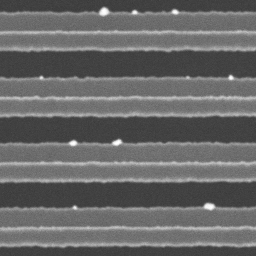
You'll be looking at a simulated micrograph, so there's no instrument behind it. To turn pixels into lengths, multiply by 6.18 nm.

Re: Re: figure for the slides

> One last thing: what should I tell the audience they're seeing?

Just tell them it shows lines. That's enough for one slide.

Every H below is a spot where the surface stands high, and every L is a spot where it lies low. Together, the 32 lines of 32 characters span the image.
LLLLLLLLLLLLLLLLLLLLLLLLLLLLLLLL
LLLLLLLLLLLLHHLLHLLLLHHLLLLLLLLL
HHHHHHHHHHHHHHHHHHHHHHHHHHHHHHHH
HHHHHHHHHHHHHHHHHHHHHHHHHHHHHHHH
HHHHHHHHHHHHHHHHHHHHHHHHHHHHHHHH
HHHHHHHHHHHHHHHHHHHHHHHHHHHHHHHH
LLLLLLLLLLLLLLLLLLLLLLLLLLLLLLLL
LLLLLLLLLLLLLLLLLLLLLLLLLLLLLLLL
LLLLLLLLLLLLLLLLLLLLLLLLLLLLLLLL
LLLLLLLLLLLLLLLLLLLLLLLLLLLLLLLL
HHHHHHHHHHHHHHHHHHHHHHHHHHHHHHHH
HHHHHHHHHHHHHHHHHHHHHHHHHHHHHHHH
HHHHHHHHHHHHHHHHHHHHHHHHHHHHHHHH
HHHHHHHHHHHHHHHHHHHHHHHHHHHHHHHH
HHHHHHHHHHHHHHHHHHHHHHHHHHHHHHHH
LLLLLLLLLLLLLLLLLLLLLLLLLLLLLLLL
LLLLLLLLLLLLLLLLLLLLLLLLLLLLLLLL
LLLLLLLLLLLLLLLLLLLLLLLLLLLLLLLL
HHHHHHHHHHHHHHHHHHHHHHHHHHHHHHHH
HHHHHHHHHHHHHHHHHHHHHHHHHHHHHHHH
HHHHHHHHHHHHHHHHHHHHHHHHHHHHHHHH
HHHHHHHHHHHHHHHHHHHHHHHHHHHHHHHH
HHHHHHHHHHHHHHHHHHHHHHHHHHHHHHHH
LLLLLLLLLLLLLLLLLLLLLLLLLLLLLLLL
LLLLLLLLLLLLLLLLLLLLLLLLLLLLLLLL
LLLLLLLLLLLLLLLLLLLLLLLLLLLLLLLL
HHHHHHHHHHHHHHHHHHHHHHHHHHHHHHHH
HHHHHHHHHHHHHHHHHHHHHHHHHHHHHHHH
HHHHHHHHHHHHHHHHHHHHHHHHHHHHHHHH
HHHHHHHHHHHHHHHHHHHHHHHHHHHHHHHH
HHHHHHHHHHHHHHHHHHHHHHHHHHHHHHHH
LLLLLLLLLLLLLLLLLLLLLLLLLLLLLLLL